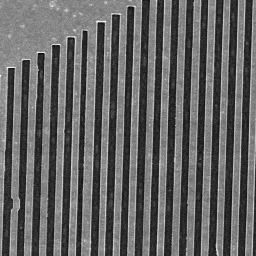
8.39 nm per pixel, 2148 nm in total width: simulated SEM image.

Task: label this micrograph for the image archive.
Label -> parallel lines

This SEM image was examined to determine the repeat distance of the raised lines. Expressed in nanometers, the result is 124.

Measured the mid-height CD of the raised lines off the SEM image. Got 6.88 pixels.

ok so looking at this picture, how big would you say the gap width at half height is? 0.065 micrometres